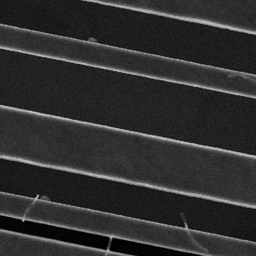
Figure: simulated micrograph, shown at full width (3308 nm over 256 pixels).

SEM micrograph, lines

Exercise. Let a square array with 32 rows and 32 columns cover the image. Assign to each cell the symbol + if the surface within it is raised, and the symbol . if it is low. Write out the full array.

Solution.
.............+++++++++++++++++++
..................++++++++++++++
.......................+++++++++
+++.........................++++
+++++++.........................
+++++++++++++...................
...++++++++++++++...............
.......++++++++++++++++.........
.............+++++++++++++++....
.................+++++++++++++++
.......................+++++++++
............................++++
................................
++..............................
+++++++.........................
++++++++++++....................
+++++++++++++++++...............
++++++++++++++++++++++..........
+++++++++++++++++++++++++++.....
++++++++++++++++++++++++++++++++
....++++++++++++++++++++++++++++
.........+++++++++++++++++++++++
..............++++++++++++++++++
...................+++++++++++++
+++.....................++++++++
++++++++.....................+++
+++++++++++++...................
..++++++++++++++++..............
........++++++++++++++++........
+++++........+++++++++++++++....
+++++++++.........++++++++++++++
+++++++++++++++........+++++++++